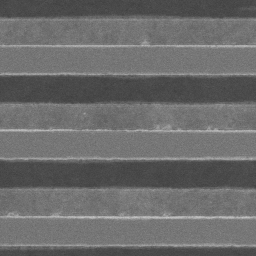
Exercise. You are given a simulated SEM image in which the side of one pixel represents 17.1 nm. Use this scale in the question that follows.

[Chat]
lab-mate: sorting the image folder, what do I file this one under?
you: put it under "lines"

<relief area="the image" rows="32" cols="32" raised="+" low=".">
................................
................................
++++++++++++++++++++++++++++++++
++++++++++++++++++++++++++++++++
++++++++++++++++++++++++++++++++
++++++++++++++++++++++++++++++++
++++++++++++++++++++++++++++++++
++++++++++++++++++++++++++++++++
++++++++++++++++++++++++++++++++
................................
................................
................................
................................
++++++++++++++++++++++++++++++++
++++++++++++++++++++++++++++++++
++++++++++++++++++++++++++++++++
++++++++++++++++++++++++++++++++
++++++++++++++++++++++++++++++++
++++++++++++++++++++++++++++++++
++++++++++++++++++++++++++++++++
................................
................................
................................
................................
++++++++++++++++++++++++++++++++
++++++++++++++++++++++++++++++++
++++++++++++++++++++++++++++++++
++++++++++++++++++++++++++++++++
++++++++++++++++++++++++++++++++
++++++++++++++++++++++++++++++++
++++++++++++++++++++++++++++++++
................................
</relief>